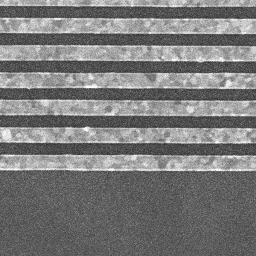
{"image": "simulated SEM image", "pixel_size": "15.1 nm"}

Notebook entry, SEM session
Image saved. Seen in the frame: parallel lines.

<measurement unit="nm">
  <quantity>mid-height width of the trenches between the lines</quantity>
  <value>194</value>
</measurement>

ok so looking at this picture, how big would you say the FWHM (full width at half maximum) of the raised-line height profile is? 218 nm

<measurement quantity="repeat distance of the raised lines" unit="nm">412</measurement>